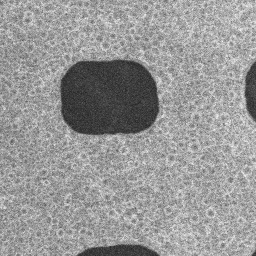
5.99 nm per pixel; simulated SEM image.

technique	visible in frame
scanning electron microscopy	holes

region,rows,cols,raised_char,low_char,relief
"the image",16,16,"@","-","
@@@@@@@@@@@@@@@@
@@@@@@@@@@@@@@@@
@@@@@@@@@@@@@@@@
@@@@@@@@@@@@@@@@
@@@@-----@@@@@@-
@@@@------@@@@@-
@@@@------@@@@@-
@@@@------@@@@@@
@@@@@@@@@@@@@@@@
@@@@@@@@@@@@@@@@
@@@@@@@@@@@@@@@@
@@@@@@@@@@@@@@@@
@@@@@@@@@@@@@@@@
@@@@@@@@@@@@@@@@
@@@@@@@@@@@@@@@@
@@@@@@---@@@@@@@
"